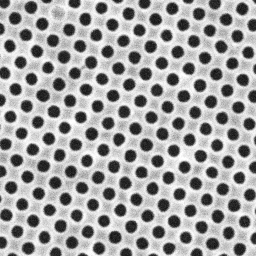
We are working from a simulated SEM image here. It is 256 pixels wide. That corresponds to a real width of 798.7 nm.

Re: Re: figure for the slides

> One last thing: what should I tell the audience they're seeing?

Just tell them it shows a regular array of holes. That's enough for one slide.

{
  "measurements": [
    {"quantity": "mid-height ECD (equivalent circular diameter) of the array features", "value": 44.3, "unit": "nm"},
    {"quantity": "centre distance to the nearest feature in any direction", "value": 60.2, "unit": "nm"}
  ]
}